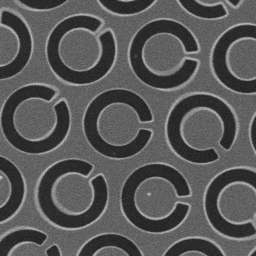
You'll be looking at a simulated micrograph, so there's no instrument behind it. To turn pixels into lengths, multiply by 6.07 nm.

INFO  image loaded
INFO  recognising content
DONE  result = an array of small figures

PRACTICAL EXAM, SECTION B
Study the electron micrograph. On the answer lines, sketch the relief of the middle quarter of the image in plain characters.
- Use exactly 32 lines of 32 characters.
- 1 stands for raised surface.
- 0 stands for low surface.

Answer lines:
01111110000011111000011111111000
00011100000111111000001111110000
00000000000111111100000000000000
00000000011111111110000000000000
00000000111111111111000000000001
11111111111111111111110000000011
11111111111100011111111111011111
11111111100000000011111111111111
11111111000000000001111111111000
11111110000000000000111111110000
01111100000111110000011111100000
01111100001111111100001111100000
01111000011111111100001111000001
00111000011111111110001111000011
00111000111111111111011111000011
01111000111111111111111110000111
01111000011111111110011110000111
01111000011111111100001111000111
11111100011111111100001111000011
11111100000111110000011111000011
11111110000000000000111111100001
11111111000000000001111111100000
11111111100000000011111111110000
11111111111100011111111111111100
00000111111111111111111111111111
00000001111111111111000000011111
00000001111111111100000000001111
01110011111111111000000000000111
11111110001111110000011000000011
11111100001111100000111111000001
11111110000111100001111111100001
11111110000111100011111111110001